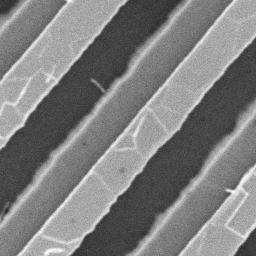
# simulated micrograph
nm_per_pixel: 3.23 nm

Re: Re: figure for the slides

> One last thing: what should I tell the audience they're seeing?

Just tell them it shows lines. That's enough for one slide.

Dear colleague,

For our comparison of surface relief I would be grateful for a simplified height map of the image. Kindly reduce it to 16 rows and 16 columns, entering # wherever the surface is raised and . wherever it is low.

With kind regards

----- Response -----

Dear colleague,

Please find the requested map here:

.#######...#####
#######...######
######....######
#####....######.
####....######..
###....######...
##....######....
##...#######...#
#....######....#
....######....##
...######....###
..######....####
.######....#####
######....######
######....######
#####....######.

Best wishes